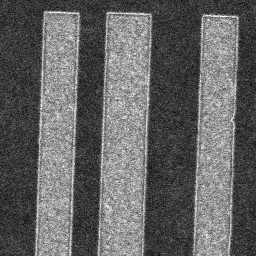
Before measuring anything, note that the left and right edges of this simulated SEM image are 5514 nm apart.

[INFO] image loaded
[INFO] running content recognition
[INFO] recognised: one or a few lines or trenches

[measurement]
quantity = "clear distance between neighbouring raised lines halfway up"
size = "0.745 micrometres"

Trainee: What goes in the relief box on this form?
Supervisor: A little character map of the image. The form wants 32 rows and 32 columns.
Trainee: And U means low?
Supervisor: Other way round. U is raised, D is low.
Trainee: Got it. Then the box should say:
UUUUUUUUUUUUUUUUUUUUUUUUUUUUUUUU
UUUUUUUUUUUUUUUUUUUUUUUUUUUUUUUU
UUUUUUDDDDUUUDDDDDDUUUUUUDDDDDUU
UUUUUUDDDDUUUDDDDDDUUUUUUDDDDDUU
UUUUUDDDDDUUUDDDDDDUUUUUUDDDDDUU
UUUUUDDDDDUUUDDDDDDUUUUUUDDDDDUU
UUUUUDDDDDUUUDDDDDDUUUUUUDDDDDUU
UUUUUDDDDDUUUDDDDDDUUUUUUDDDDDUU
UUUUUDDDDDUUUDDDDDDUUUUUUDDDDDUU
UUUUUDDDDDUUUDDDDDDUUUUUUDDDDUUU
UUUUUDDDDDUUUDDDDDUUUUUUUDDDDUUU
UUUUUDDDDDUUUDDDDDUUUUUUUDDDDUUU
UUUUUDDDDUUUUDDDDDUUUUUUUDDDDUUU
UUUUUDDDDUUUUDDDDDUUUUUUUDDDDUUU
UUUUUDDDDUUUUDDDDDUUUUUUUDDDDUUU
UUUUUDDDDUUUUDDDDDUUUUUUUDDDDUUU
UUUUUDDDDUUUUDDDDDUUUUUUUDDDDUUU
UUUUUDDDDUUUUDDDDDUUUUUUUDDDDUUU
UUUUUDDDDUUUUDDDDDUUUUUUUDDDDUUU
UUUUUDDDDUUUUDDDDDUUUUUUUDDDDUUU
UUUUUDDDDUUUUDDDDDUUUUUUUDDDDUUU
UUUUUDDDDUUUUDDDDDUUUUUUUDDDDUUU
UUUUUDDDDUUUUDDDDDUUUUUUUDDDDUUU
UUUUUDDDDUUUUDDDDDUUUUUUUDDDDUUU
UUUUUDDDDUUUUDDDDDUUUUUUUDDDDUUU
UUUUUDDDDUUUUDDDDDUUUUUUDDDDDUUU
UUUUUDDDDUUUDDDDDDUUUUUUDDDDDUUU
UUUUUDDDDUUUUDDDDDUUUUUUDDDDDUUU
UUUUUDDDDUUUUDDDDDUUUUUUDDDDDUUU
UUUUUDDDDUUUDDDDDDUUUUUUDDDDDUUU
UUUUUDDDDUUUDDDDDDUUUUUUDDDDDUUU
UUUUDDDDDUUUDDDDDDUUUUUUDDDDDUUU